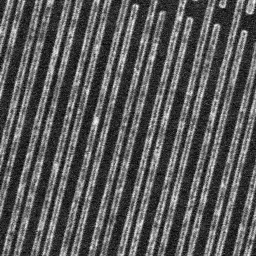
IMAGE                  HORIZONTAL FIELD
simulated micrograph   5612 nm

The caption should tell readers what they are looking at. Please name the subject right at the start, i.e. parallel lines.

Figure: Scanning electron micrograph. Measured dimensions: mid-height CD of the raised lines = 95.8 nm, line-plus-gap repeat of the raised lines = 306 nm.